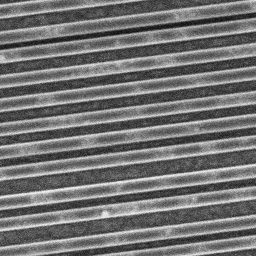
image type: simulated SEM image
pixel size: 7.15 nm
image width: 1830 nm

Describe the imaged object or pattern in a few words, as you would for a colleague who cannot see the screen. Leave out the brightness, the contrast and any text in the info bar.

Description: parallel lines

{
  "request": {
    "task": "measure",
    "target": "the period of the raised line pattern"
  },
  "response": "0.169 um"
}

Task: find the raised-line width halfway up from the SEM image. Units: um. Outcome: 0.0905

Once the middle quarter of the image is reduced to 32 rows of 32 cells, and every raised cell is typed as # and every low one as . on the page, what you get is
....######################......
##################..............
##########......................
##.......................#######
.................###############
.........#######################
.#########################......
##################..............
##########......................
##.........................#####
...................#############
...........#####################
...########################.....
###################.............
###########.....................
###.....................########
................################
........########################
#########################.......
#################...............
#########...................####
#...................############
............####################
....########################....
####################............
############....................
####............................
.............................#.#
.....................###########
..............##################
.....########################...
#####################...........